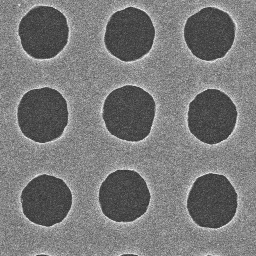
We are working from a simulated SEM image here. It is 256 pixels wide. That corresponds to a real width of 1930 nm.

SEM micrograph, a regular array of holes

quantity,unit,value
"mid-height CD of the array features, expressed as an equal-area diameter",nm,394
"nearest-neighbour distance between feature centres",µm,0.604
